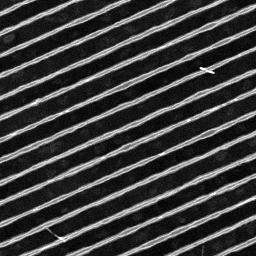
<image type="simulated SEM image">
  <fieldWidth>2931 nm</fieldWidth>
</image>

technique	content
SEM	parallel lines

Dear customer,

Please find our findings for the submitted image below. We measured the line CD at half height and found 3.77 pixels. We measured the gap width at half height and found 176 nanometers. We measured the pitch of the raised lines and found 0.222 microns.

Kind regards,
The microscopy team